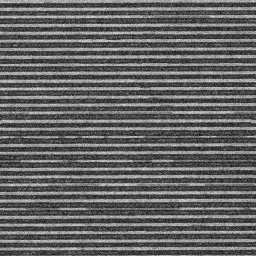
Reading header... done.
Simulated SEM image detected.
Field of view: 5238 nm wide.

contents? parallel lines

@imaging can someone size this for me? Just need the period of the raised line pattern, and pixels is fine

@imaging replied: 7.99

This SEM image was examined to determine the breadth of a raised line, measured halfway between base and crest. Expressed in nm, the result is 51.2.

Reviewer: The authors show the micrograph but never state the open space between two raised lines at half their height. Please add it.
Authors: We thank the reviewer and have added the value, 123 nanometres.